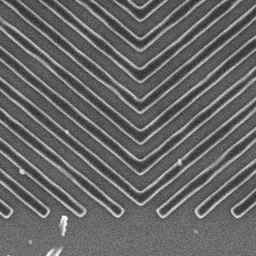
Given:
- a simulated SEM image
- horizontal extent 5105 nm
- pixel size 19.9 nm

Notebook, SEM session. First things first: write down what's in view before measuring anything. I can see groups of lines, slits or small figures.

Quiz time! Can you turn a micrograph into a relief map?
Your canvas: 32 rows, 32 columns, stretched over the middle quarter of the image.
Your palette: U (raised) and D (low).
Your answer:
DDDDUUUUUDDDDDUUUUDDUUUUDDDDDUUU
DDDDDUUUUUDDDDDUUUUUUUUDDDDDUUUU
UUDDDDDUUUUDDDDDUUUUUUDDDDDUUUUD
UUUDDDDDUUUUDDDDDUUUUDDDDDUUUUDD
UUUUDDDDDUUUUDDDDDDDDDDDDUUUUDDD
DUUUUDDDDDDUUUDDDDDDDDDUUUUUDDDD
DDUUUUUDDDDDUUUUDDDDDDUUUUDDDDDD
DDDDUUUUDDDDDUUUUDDDDUUUUDDDDDUU
DDDDDUUUUDDDDDUUUUDDUUUUDDDDDUUU
UDDDDDUUUUDDDDDUUUUUUUUDDDDDUUUU
UUDDDDDUUUUDDDDDDUUUUUDDDDDUUUUD
UUUDDDDDUUUUUDDDDDUUDDDDDUUUUUDD
UUUUDDDDDDUUUUDDDDDDDDDDUUUUDDDD
DUUUUUDDDDDUUUUDDDDDDDDUUUUDDDDD
DDDUUUUDDDDDUUUUDDDDDDUUUUDDDDDU
DDDDUUUUDDDDDUUUUUDDDUUUUDDDDDUU
DDDDDUUUUUDDDDUUUUUUUUUUDDDDDUUU
UDDDDDUUUUUDDDDDUUUUUUDDDDDDUUUD
UUUDDDDDUUUUDDDDDUUUUDDDDDUUUUDD
UUUUDDDDDUUUUDDDDDUUDDDDDUUUUDDD
DUUUUDDDDDUUUUDDDDDDDDDDUUUUDDDD
DDUUUUDDDDDUUUUDDDDDDDDUUUUDDDDD
DDDUUUUUDDDDDUUUUDDDDUUUUDDDDDDU
DDDDDUUUUDDDDDUUUUDDUUUUDDDDDDUU
DDDDDDUUUUDDDDDUUUUUUUUDDDDDUUUU
UDDDDDDUUUUDDDDDUUUUUUDDDDDUUUUD
UUUDDDDDUUUUDDDDDUUUUDDDDDUUUUDD
DUUUDDDDDUUUUUDDDDDDDDDDDUUUUDDD
DDUUUDDDDDUUUUUDDDDDDDDDUUUUDDDD
DDDUUUUDDDDDUUUUDDDDDDDUUUUDDDDU
DDDDUUUUDDDDDUUUUDDDDUUUUDDDDDUU
DDDDDUUUUDDDDDUUUUDDUUUUDDDDDUUU